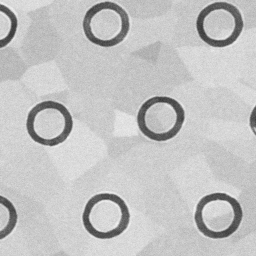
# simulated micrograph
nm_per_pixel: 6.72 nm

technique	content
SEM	ring-shaped grooves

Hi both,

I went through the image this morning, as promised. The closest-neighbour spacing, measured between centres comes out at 734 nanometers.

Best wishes